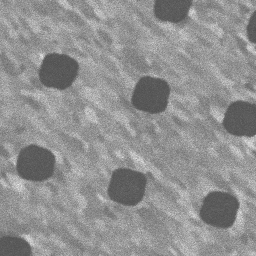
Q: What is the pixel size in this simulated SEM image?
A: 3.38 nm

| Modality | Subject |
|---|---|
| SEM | holes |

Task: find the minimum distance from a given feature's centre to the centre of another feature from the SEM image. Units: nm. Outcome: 320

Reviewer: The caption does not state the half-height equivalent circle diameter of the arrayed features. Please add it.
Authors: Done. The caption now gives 129 nanometres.